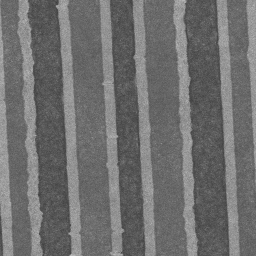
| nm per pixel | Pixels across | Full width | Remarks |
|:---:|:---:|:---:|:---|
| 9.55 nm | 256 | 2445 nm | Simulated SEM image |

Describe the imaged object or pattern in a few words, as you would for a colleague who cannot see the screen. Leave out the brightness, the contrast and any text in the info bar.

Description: one or a few lines or trenches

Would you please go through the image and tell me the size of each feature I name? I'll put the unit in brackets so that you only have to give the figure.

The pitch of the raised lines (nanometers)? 716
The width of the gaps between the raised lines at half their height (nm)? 385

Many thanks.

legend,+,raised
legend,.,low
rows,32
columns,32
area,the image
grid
+++.....+++++....+++++......+++.
+++.....+++++....+++++......+++.
+++.....+++++....+++++......++++
+++.....+++++....+++++......++++
+++.....+++++....++++++.....++++
+++.....+++++.....+++++.....++++
+++.....+++++.....+++++.....++++
+++.....+++++....++++++.....++++
+++......++++.....+++++.....++++
+++......+++++....+++++.....++++
++++.....+++++....+++++.....++++
++++.....+++++....+++++.....++++
++++.....+++++....+++++.....++++
++++.....+++++....+++++......+++
++++.....+++++....+++++......+++
++++.....+++++....+++++......+++
++++.....+++++....+++++......+++
++++.....+++++....+++++......+++
++++.....+++++....+++++......+++
++++.....+++++....+++++......+++
++++.....+++++....+++++......+++
.+++.....+++++....+++++......+++
.+++.....+++++....++++++.....+++
.+++.....+++++.....+++++.....+++
.+++.....+++++.....+++++.....+++
.+++.....+++++.....+++++.....+++
.++++....+++++.....+++++.....+++
.+++.....+++++.....+++++.....+++
.+++.....++++++....+++++.....+++
.+++.....++++++....+++++.....+++
.+++......+++++....+++++.....+++
.++++.....+++++....+++++.....+++